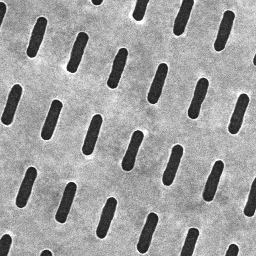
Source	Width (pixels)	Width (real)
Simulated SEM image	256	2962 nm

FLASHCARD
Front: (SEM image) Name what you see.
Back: a regular array of holes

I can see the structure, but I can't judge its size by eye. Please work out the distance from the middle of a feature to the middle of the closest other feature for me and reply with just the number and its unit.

497 nanometers